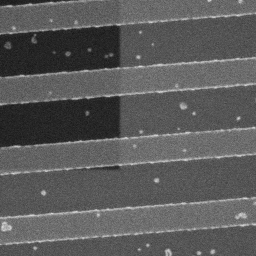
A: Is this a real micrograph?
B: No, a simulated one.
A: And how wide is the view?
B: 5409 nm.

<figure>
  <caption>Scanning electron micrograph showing lines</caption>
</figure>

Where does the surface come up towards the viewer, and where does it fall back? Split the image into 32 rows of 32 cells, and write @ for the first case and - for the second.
-----@@@@@@@@@@@@@@@@@@@@@@@@@@@
@@@@@@@@@@@@@@@@@@@@@@@@@@@@@@@@
@@@@@@@@@@@@@@@@@@@@@@----------
@@@@@@@@@-----------------------
--------------------------------
--------------------------------
--------------------------------
-----------------------------@@@
---------------@@@@@@@@@@@@@@@@@
---@@@@@@@@@@@@@@@@@@@@@@@@@@@@@
@@@@@@@@@@@@@@@@@@@@@@@@@@@@@@@@
@@@@@@@@@@@@@@@@@@@@------------
@@@@@@--------------------------
--------------------------------
--------------------------------
--------------------------------
-------------------------@@@@@@@
-------------@@@@@@@@@@@@@@@@@@@
@@@@@@@@@@@@@@@@@@@@@@@@@@@@@@@@
@@@@@@@@@@@@@@@@@@@@@@@@@@@@@---
@@@@@@@@@@@@@@@@----------------
@@@@----------------------------
--------------------------------
--------------------------------
--------------------------------
----------------------@@@@@@@@@@
----------@@@@@@@@@@@@@@@@@@@@@@
@@@@@@@@@@@@@@@@@@@@@@@@@@@@@@@@
@@@@@@@@@@@@@@@@@@@@@@@@@@------
@@@@@@@@@@@@@@------------------
--------------------------------
--------------------------------